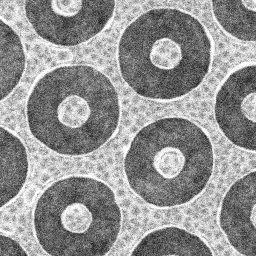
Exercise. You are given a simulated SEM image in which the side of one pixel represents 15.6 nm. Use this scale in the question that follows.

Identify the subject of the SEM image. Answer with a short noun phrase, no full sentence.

ring-shaped grooves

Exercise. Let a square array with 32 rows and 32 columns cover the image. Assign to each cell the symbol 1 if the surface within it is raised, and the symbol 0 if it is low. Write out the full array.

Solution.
11100001110000111111111111000001
11100001110000111100000111100000
11110000000000111000000001100000
01110000000001110000000000110000
00111000000011100000000000111000
00011110001111100001110000111111
00011111111111100001111000111111
00011111111111100001111000111111
00011110000011100000110000111100
00011000000001100000000000111000
00110000000000110000000001110000
00110000000000011000000011100000
11110000110000011110001111100001
11100001111000011111111111100011
11100001111000011111111111100001
11100000110000011110000011100000
01110000000000111000000001110000
00011000000001111000000000111000
00011100000011110000000000011100
00011111111111110000111000011111
00001111111111110000111000011111
00011111111111110000110000011110
00011110000011110000000000111100
00011100000000110000000000111000
00111000000000111000000001110000
01111000010000011110000111110000
11110000111000011111111111100000
11110000111000011111111111100001
11110000111000011111001111110000
01111000000000011100000001110000
00111000000000111000000000111000
00011100000001110000000000111100